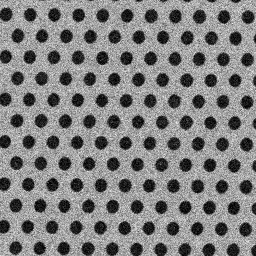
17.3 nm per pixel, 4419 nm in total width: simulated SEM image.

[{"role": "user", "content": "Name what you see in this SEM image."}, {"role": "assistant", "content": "a regular array of holes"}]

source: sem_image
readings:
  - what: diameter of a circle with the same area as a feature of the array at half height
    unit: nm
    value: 228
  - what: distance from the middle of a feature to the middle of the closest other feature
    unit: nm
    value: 416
